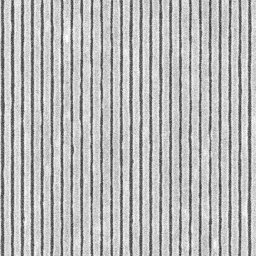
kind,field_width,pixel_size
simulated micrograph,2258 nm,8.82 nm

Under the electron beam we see parallel lines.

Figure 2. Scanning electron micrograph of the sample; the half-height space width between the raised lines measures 26.5 nanometres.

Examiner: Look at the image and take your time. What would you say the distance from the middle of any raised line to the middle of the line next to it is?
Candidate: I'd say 87.2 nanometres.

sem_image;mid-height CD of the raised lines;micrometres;0.0529